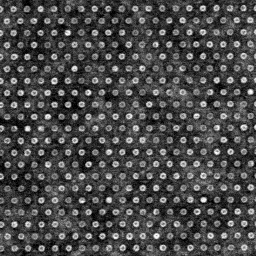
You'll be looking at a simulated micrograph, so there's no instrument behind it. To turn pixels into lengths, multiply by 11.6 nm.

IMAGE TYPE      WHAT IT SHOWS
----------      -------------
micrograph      a regular array of raised bodies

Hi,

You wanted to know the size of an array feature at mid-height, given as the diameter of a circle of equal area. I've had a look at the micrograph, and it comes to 68.2 nanometres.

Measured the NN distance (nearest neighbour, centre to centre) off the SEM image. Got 0.155 microns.